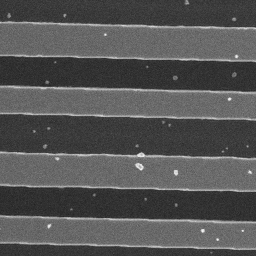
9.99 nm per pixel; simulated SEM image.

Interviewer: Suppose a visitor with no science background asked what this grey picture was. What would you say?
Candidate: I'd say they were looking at lines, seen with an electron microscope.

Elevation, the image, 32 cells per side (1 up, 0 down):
00000000000000000000000000000000
00000000000000000000000000000000
00000000000000000000000000000000
11111111111111111111111111111111
11111111111111111111111111111111
11111111111111111111111111111111
11111111111111111111111111111111
00000000000000000000000000001111
00000000000000000000000000000000
00000000000000000000000000000000
00000000000000000000000000000000
11111111111111111111111111110000
11111111111111111111111111111111
11111111111111111111111111111111
00000000000011111111111111111111
00000000000000000000000000000000
00000000000000000000000000000000
00000000000000000000000000000000
00000000000000000000000000000000
11111111111111111110000000000000
11111111111111111111111111111111
11111111111111111111111111111111
11111111111111111111111111111111
00000000000000111111111111111111
00000000000000000000000000000000
00000000000000000000000000000000
00000000000000000000000000000000
11111111111111111111000000000000
11111111111111111111111111111111
11111111111111111111111111111111
00000011111111111111111111111111
00000000000000000000000000000000